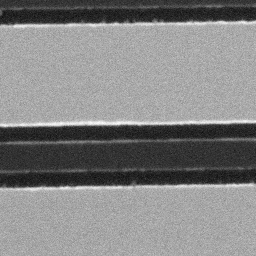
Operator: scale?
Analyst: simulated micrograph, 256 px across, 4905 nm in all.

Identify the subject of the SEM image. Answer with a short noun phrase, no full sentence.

lines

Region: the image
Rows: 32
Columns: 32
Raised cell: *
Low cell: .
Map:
********************************
................................
................................
********************************
********************************
********************************
********************************
********************************
********************************
********************************
********************************
********************************
********************************
********************************
********************************
********..........**............
................................
...........................*****
********************************
********************************
********************************
................................
................................
***.****************************
********************************
********************************
********************************
********************************
********************************
********************************
********************************
********************************